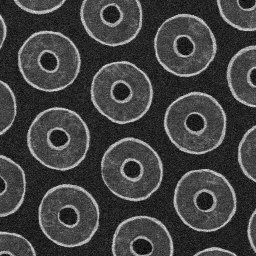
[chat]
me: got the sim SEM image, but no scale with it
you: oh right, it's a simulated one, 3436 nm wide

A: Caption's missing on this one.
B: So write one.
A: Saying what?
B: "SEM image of a regular array of ring-shaped raised bodies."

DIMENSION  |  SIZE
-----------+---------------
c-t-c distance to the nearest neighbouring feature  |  1.04 µm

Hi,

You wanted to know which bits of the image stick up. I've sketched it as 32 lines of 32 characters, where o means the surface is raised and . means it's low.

..oooooo..ooooooo..........ooo..
....o.....ooo..ooo..........oooo
..........ooo..ooo...oooo...oooo
o..........oooooo...oooooo....oo
o...oooo....ooooo...ooooooo.....
...oooooo....oo....ooo..ooo.....
..oooooooo..........oo..ooo...oo
..ooo..ooo..........oooooo...ooo
...oo..ooo...oooo....oooo....ooo
...ooooooo..oooooo...........oo.
o...ooooo...oo..ooo..........oo.
o...........oo..ooo..........ooo
oo..........oo..ooo...ooooo...oo
oo..........oooooo...ooooooo....
oo...ooooo...ooooo...ooo.ooo....
o...oooooo...........oo...oo....
....oo..ooo..........ooo.ooo...o
....oo...oo.....o.....oooooo..oo
....ooo.ooo...ooooo....oooo...oo
....oooooo...ooooooo..........oo
oo....oooo...oo..ooo..........oo
ooo..........oo...oo....ooo....o
ooo..........ooooooo...ooooo....
.oo....ooo....ooooo...ooooooo...
ooo...ooooo....ooo....ooo..oo...
oo...ooooooo..........oo...oo...
oo...oo...oo..........ooooooo...
.....oo...oo....ooo....oooooo..o
.....ooooooo...oooooo...ooo....o
oo....ooooo...ooooooo..........o
oooo....oo....ooo..oo...........
oooo..........ooo..oo....oooo...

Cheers